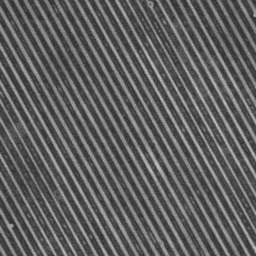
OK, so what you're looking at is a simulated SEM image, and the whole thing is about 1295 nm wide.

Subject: parallel lines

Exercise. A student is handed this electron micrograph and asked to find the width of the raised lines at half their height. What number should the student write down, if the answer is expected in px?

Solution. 2.94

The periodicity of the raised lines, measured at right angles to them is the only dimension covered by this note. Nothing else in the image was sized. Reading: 44.9 nm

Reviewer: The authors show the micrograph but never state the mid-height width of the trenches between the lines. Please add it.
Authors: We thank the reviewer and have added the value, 29.8 nanometers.